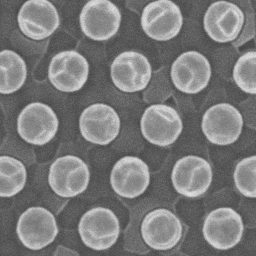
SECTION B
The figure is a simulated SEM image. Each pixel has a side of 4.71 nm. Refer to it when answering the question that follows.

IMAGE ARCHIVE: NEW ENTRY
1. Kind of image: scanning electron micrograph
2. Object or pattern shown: a regular array of raised bodies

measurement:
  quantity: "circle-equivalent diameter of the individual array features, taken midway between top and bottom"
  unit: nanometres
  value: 186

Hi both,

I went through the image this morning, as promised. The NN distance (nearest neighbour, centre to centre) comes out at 0.284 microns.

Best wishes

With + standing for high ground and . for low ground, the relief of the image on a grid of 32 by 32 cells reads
...+++.....+++.....+++.....++...
...++++...+++++...++++....++++..
..+++++...+++++...+++++...++++..
...++++...+++++...++++....++++..
....++.....+++.....+++....++++..
................................
++..............................
+++....++++...++++....++++....++
+++...+++++...+++++...++++...+++
+++...+++++...+++++...++++...+++
+++....+++....++++....++++....++
+..............................+
................................
...+++.....+++.....++.....+++...
..+++++...+++++...++++....++++..
..+++++...+++++...+++++..+++++..
..+++++...+++++...++++....++++..
...+++.....+++.....+++....+++...
................................
................................
+++....+++.....+++....++++....++
+++...+++++...++++....++++...+++
+++...+++++...++++....++++...+++
+++....++++...++++....++++....++
........+......++..............+
................................
...+++.....+++.....++......++...
..+++++...+++++...++++....++++..
..+++++...+++++...+++++...++++..
..+++++...+++++...++++....++++..
...+++.....+++.....+++....+++...
................................